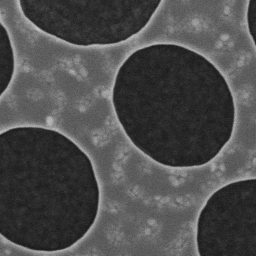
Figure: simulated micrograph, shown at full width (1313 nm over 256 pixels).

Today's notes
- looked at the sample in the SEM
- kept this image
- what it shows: holes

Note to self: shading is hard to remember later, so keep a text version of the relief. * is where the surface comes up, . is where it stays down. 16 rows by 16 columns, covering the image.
*.........******
**.......*******
.***....********
.*******.....***
.******.......**
*******.......**
*******........*
*******........*
....****......**
.....****.....**
......**********
......********..
......*******...
......******....
.....*******....
**..********....